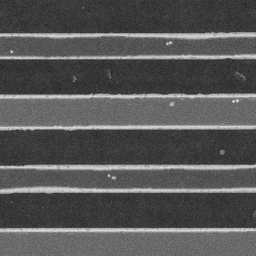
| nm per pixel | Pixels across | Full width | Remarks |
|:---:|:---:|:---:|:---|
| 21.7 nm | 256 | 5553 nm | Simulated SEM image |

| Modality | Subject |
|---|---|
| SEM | lines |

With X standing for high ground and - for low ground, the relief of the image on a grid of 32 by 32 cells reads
--------------------------------
--------------------------------
--------------------------------
--------------------------------
XXXXXXXXXXXXXXXXXXXXXXXXXXXXXXXX
XXXXXXXXXXXXXXXXXXXXXXXXXXXXXXXX
XXXXXXXXXXXXXXXXXXXXXXXXXXXXXXXX
--------------------------------
--------------------------------
--------------------------------
--------------------------------
--------------------------------
XXXXXXXXXXXXXXXXXXXXXXXXXXXXXXXX
XXXXXXXXXXXXXXXXXXXXXXXXXXXXXXXX
XXXXXXXXXXXXXXXXXXXXXXXXXXXXXXXX
XXXXXXXXXXXXXXXXXXXXXXXXXXXXXXXX
--------------------------------
--------------------------------
--------------------------------
--------------------------------
--------------------------------
XXXXXXXXXXXXXXXXXXXXXXXXXXXXXXXX
XXXXXXXXXXXXXXXXXXXXXXXXXXXXXXXX
XXXXXXXXXXXXXXXXXXXXXXXXXXXXXXXX
--------------------------------
--------------------------------
--------------------------------
--------------------------------
--------------------------------
XXXXXXXXXXXXXXXXXXXXXXXXXXXXXXXX
XXXXXXXXXXXXXXXXXXXXXXXXXXXXXXXX
XXXXXXXXXXXXXXXXXXXXXXXXXXXXXXXX